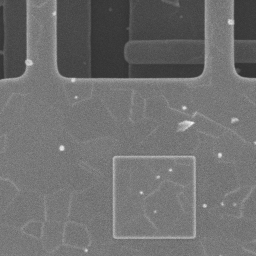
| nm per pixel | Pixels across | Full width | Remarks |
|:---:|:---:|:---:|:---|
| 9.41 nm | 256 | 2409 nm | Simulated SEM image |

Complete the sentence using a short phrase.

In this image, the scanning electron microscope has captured wiring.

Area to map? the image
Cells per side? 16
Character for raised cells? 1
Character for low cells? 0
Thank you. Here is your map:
0010000000000110
0010000000000110
0010000000000110
0010000000000110
0111000000000110
1111111111111111
1111111111111111
1111111111111111
1111111111111111
1111111111111111
1111111111111111
1111111111111111
1111111111111111
1111111111111111
1111111111111111
1111111111111111